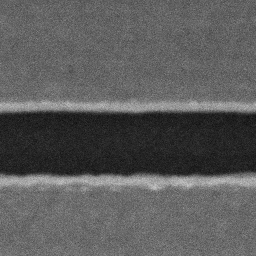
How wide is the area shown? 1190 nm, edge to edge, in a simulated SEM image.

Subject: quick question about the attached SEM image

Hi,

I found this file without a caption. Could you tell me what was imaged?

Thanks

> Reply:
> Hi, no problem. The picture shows one or a few lines or trenches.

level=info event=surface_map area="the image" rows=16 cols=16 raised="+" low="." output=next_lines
++++++++++++++++
++++++++++++++++
++++++++++++++++
++++++++++++++++
++++++++++++++++
++++++++++++++++
++++++++++++++++
................
................
................
................
++++++++++++++++
++++++++++++++++
++++++++++++++++
++++++++++++++++
++++++++++++++++